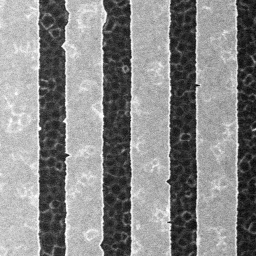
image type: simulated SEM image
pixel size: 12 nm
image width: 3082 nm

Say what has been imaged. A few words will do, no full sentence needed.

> one or a few lines or trenches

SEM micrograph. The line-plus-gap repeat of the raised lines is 66.1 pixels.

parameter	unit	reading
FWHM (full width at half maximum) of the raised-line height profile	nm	456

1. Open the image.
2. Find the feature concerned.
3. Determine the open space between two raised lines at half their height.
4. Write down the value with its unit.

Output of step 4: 337 nanometres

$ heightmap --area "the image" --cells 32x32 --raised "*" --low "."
*****...*****...*****....****...
*****....****...*****....*****..
*****....****...*****....****...
*****...*****...*****....*****..
*****...*****...*****....*****..
*****...*****...*****....*****..
*****...*****....****....*****..
*****...*****...*****....*****..
*****...*****....****....*****..
*****...*****....****....****...
*****...*****....****....*****..
*****...*****...*****....*****..
*****...*****...*****....*****..
*****...*****...*****....*****..
*****...*****...*****....*****..
*****...*****...*****....*****..
*****...*****...*****....*****..
*****...*****...*****....*****..
*****...*****...*****....*****..
*****...*****...*****....*****..
*****...*****...*****....*****..
*****...*****....****....*****..
*****...*****...*****....*****..
*****...*****...*****....*****..
*****...*****...*****....*****..
*****...*****...*****....*****..
*****...*****...*****....*****..
*****...*****...*****....*****..
*****...*****...*****....*****..
*****...*****...*****....****...
*****...*****....****....****...
*****...*****...*****....*****..